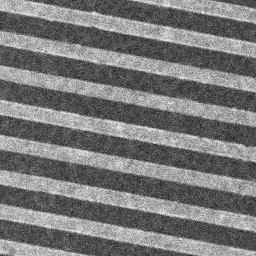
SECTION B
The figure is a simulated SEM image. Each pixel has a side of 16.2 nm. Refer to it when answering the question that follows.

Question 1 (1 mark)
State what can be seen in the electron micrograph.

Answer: parallel lines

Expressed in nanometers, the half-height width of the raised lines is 203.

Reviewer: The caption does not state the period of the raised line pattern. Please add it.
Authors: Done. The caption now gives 553 nm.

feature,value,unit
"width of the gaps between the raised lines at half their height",344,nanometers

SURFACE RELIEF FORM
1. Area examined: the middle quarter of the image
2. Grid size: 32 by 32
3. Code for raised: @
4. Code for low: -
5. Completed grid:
--------------@@@@@@@@@@@@@@@@@-
-------------------@@@@@@@@@@@@@
-------------------------@@@@@@@
@-----------------------------@@
@@@@@@-------------------@@-----
@@@@@@@@@@@---------------------
@@@@@@@@@@@@@@@-----------------
----@@@@@@@@@@@@@@@@@-----------
----------@@@@@@@@@@@@@@@@------
---------------@@@@@@@@@@@@@@@@@
--------------------@@@@@@@@@@@@
--------------------------@@@@@@
@------------------------------@
@@@@@@@-------------------------
@@@@@@@@@@@@--------------------
-@@@@@@@@@@@@@@@@@--------------
------@@@@@@@@@@@@@@@@@---------
------------@@@@@@@@@@@@@@@@----
-----------------@@@@@@@@@@@@@@@
-----------------------@@@@@@@@@
----------------------------@@@@
@@@@----------------------------
@@@@@@@@@-----------------------
@@@@@@@@@@@@@@------------------
--@@@@@@@@@@@@@@@@@@------------
-------@@@@@@@@@@@@@@@@@@-------
-------------@@@@@@@@@@@@@@@@@@-
------------------@@@@@@@@@@@@@@
-----------------------@@@@@@@@@
-----------------------------@@@
@@@@----------------------------
@@@@@@@@@@----------------------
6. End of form